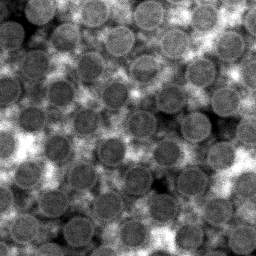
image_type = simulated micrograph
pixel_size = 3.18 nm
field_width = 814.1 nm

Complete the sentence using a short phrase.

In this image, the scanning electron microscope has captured a regular array of raised bodies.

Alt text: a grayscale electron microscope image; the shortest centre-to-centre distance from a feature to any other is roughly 121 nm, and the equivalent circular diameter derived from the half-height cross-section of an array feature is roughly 90.9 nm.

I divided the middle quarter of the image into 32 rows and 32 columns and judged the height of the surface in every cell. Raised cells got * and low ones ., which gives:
...*******.......*******.......*
...*******.......*******.......*
....******.......*******.......*
....*****........******........*
**..........**....****.........*
**........******.........****...
***.......******........******..
***......*******.......*******..
***......*******.......*******..
**........******.......*******..
*.........*****.........******..
....****................*****...
...******........*****..........
..*******.......*******.......**
..*******.......*******.......**
..*******.......*******.......**
...*****........*******.......**
....***..........*****........**
*..........***....***.........**
**........*****.........****....
**.......******........******...
**.......*******......*******...
*........*******......*******...
*........******.......*******...
..........****.........*****....
...****.................***.....
..******........*****..........*
.*******.......*******.......***
.*******.......*******.......***
.*******.......*******......****
..*****........******.......****
...***..........*****........***